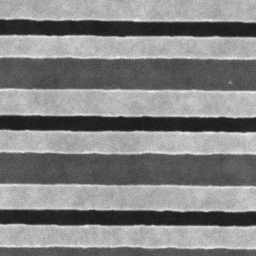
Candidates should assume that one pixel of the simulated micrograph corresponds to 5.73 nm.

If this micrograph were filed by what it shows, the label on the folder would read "lines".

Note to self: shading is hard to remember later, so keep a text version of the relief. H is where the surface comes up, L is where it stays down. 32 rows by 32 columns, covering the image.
HHHHHHHHHHHHHHHHHHHHHHHHHHHHHHHH
HHHHHHHHHHHHHHHHHHHHHHHHHHHHHHHH
LLLLHHHHLHHLHHHHHHHHHHHHHHHHHHHH
LLLLLLLLLLLLLLLLLLLLLLLLLLLLLLLL
LHLHLLLLLLHLLLLLLLLLLLLLLLLLLLLL
HHHHHHHHHHHHHHHHHHHHHHHHHHHHHHHH
HHHHHHHHHHHHHHHHHHHHHHHHHHHHHHHH
LLLLLLLLLLLLLLLLLLLLLLLLLLLLLLLL
LLLLLLLLLLLLLLLLLLLLLLLLLLLLLLLL
LLLLLLLLLLLLLLLLLLLLLLLLLLLLLLLL
LLLLLLLLLLLLLLLLLLLLLLLLLLLLLLLL
HHHHHHHHHHHHHHHHHHHHHHHHHHHHHHHH
HHHHHHHHHHHHHHHHHHHHHHHHHHHHHHHH
HHHHHHHHHHHHHHHHHHHHHHHHHHHHHHHH
LLLLLLLLLLLLHHHHHHHHHHHHHHHHHHHH
LLLLLLLLLLLLLLLLLLLLLLLLLLLLLLLL
HHHHHHHHHLLLLHHLHHLLLLLLLLLLLLLL
HHHHHHHHHHHHHHHHHHHHHHHHHHHHHHHH
HHHHHHHHHHHHHHHHHHHHHHHHHHHHHHHH
LLLLLLLLLLLLLLLLLLLLLLLLLLLLLLLL
LLLLLLLLLLLLLLLLLLLLLLLLLLLLLLLL
LLLLLLLLLLLLLLLLLLLLLLLLLLLLLLLL
LLLLLLLLLLLLLLLLLLLLLLLLLLLLLLLL
HHHHHHHHHHHHHHHHHHHHHHHHHHHHHHHH
HHHHHHHHHHHHHHHHHHHHHHHHHHHHHHHH
HHHHHHHHHHHHHHHHHHHHHHHHHHHHHHHH
LLLLLLLLLLLLLLLLLLLLLLLLLLLLLHLL
LLLLLLLLLLLLLLLLLLLLLLLLLLLLLLLL
HHHHHHHHHHHHHHHHHHHHHHHHHHHHHHHH
HHHHHHHHHHHHHHHHHHHHHHHHHHHHHHHH
HHHHHHHHHHHHHHHHHHHHHHHHHHHHHHHH
LLLLLLLLLLLLLLLLLLLLLLLLLLLLLLLL